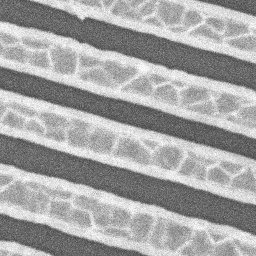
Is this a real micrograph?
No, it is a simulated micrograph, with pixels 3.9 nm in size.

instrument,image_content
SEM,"one or a few lines or trenches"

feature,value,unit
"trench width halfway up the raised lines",133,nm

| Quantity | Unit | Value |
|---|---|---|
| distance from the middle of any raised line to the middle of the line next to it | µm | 0.27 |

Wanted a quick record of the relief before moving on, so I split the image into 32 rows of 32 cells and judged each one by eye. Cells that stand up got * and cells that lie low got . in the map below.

.......*****************........
..........******************....
..............******************
*.................**************
******...............***********
*********................*******
************.................***
****************................
...****************.............
......*****************.........
..........****************......
.............*****************..
***...............**************
*******..............***********
**********..............********
**************..............****
.****************..............*
.....****************...........
........*****************.......
............****************....
...............*****************
**.................*************
******.................*********
**********................******
*************................***
****************................
.*******************............
......*****************.........
........********************....
...........*******************..
...............*****************
****...............*************